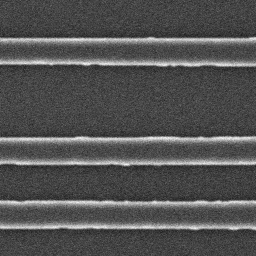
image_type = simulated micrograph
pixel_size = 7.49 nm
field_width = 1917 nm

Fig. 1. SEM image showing lines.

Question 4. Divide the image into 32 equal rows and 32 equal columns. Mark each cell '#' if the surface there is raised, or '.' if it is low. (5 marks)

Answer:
................................
................................
................................
................................
................................
################################
################################
################################
................................
................................
................................
................................
................................
................................
................................
................................
................................
################################
################################
################################
..##############################
................................
................................
................................
................................
################################
################################
################################
#######.########################
................................
................................
................................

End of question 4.